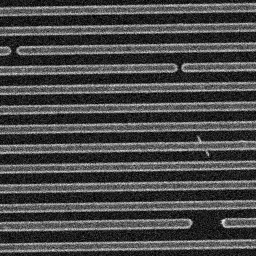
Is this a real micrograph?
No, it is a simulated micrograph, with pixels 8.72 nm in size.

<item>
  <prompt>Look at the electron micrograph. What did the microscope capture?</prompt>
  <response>parallel lines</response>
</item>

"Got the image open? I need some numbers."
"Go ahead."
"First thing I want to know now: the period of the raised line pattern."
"172 nanometres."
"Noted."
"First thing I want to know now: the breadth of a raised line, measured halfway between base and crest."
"69.8 nm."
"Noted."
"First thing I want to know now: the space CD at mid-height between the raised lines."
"105 nm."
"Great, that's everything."